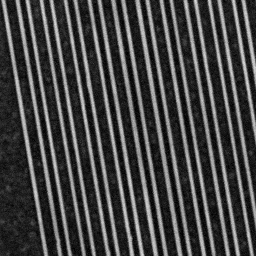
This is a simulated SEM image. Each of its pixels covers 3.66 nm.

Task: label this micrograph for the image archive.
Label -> parallel lines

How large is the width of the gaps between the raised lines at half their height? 0.0362 um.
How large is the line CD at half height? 10.8 nanometres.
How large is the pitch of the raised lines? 0.0435 microns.